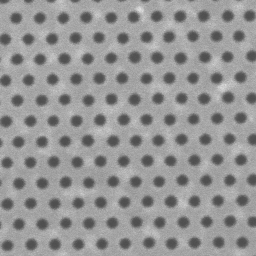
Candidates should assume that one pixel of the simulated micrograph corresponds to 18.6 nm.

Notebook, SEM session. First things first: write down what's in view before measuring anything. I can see a regular array of holes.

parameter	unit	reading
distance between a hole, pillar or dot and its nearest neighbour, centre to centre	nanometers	427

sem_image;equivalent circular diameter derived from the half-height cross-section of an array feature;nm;238